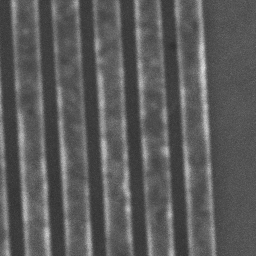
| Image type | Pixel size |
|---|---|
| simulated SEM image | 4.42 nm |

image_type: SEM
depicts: parallel lines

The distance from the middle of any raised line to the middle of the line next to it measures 41 px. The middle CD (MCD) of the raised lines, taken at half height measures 0.11 microns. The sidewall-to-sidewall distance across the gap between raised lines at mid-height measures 0.0734 microns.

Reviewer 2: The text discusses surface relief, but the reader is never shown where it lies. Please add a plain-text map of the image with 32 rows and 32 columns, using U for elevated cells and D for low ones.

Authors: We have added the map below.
DDUUUDDUUUDDUUUDDUUUDDUUUDDDDDDD
DDUUUDDUUUDDUUUDDUUUDDUUUDDDDDDD
DDUUUDDUUUDDUUUDDUUUDDUUUDDDDDDD
DDUUUDDUUUDDUUUDDUUUDDUUUDDDDDDD
DDUUUDDUUUDDUUUDDUUUDDUUUDDDDDDD
DDUUUDDUUUDDUUUDDUUUDDUUUDDDDDDD
DDUUUDDUUUDDUUUDDUUUDDUUUDDDDDDD
DDUUUDDUUUDDUUUDDUUUDDUUUDDDDDDD
DDUUUDDUUUDDUUUDDUUUDDDUUDDDDDDD
DDUUUDDUUUDDUUUDDUUUDDDUUUDDDDDD
DDUUUDDUUUDDUUUDDUUUDDDUUUDDDDDD
DDUUUDDUUUDDUUUDDUUUUDDUUUDDDDDD
DDUUUDDUUUDDUUUUDDUUUDDUUUDDDDDD
DDUUUDDUUUDDDUUUDDUUUDDUUUDDDDDD
DDUUUDDUUUDDDUUUDDUUUDDUUUDDDDDD
DDUUUDDDUUDDDUUUDDUUUDDUUUDDDDDD
DDUUUDDDUUUDDUUUDDUUUDDUUUDDDDDD
DDUUUDDDUUUDDUUUDDUUUDDUUUDDDDDD
DDUUUUDDUUUDDUUUDDUUUDDUUUDDDDDD
UDDUUUDDUUUDDUUUDDUUUDDUUUDDDDDD
UDDUUUDDUUUDDUUUDDUUUDDUUUDDDDDD
UDDUUUDDUUUDDUUUDDUUUDDUUUDDDDDD
UDDUUUDDUUUDDUUUDDUUUDDUUUDDDDDD
UDDUUUDDUUUDDUUUDDUUUDDUUUDDDDDD
UDDUUUDDUUUDDUUUDDUUUDDUUUDDDDDD
UDDUUUDDUUUDDUUUDDUUUDDUUUDDDDDD
UDDUUUDDUUUDDUUUDDUUUDDDUUDDDDDD
UDDUUUDDUUUDDUUUDDUUUDDDUUUDDDDD
UDDUUUDDUUUDDUUUDDUUUDDDUUUDDDDD
UDDUUUDDUUUDDUUUDDDUUUDDUUUDDDDD
UDDUUUDDUUUDDUUUDDDUUUDDUUUDDDDD
UDDUUUDDUUUDDDUUUDDUUUDDUUUDDDDD